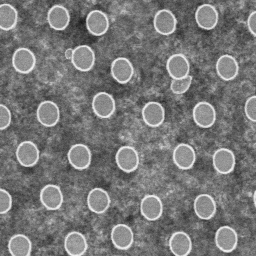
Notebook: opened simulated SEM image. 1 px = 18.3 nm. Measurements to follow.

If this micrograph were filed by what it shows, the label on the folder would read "a regular array of raised bodies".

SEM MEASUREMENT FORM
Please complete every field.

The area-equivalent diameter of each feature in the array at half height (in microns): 0.418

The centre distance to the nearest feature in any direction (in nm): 770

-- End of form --